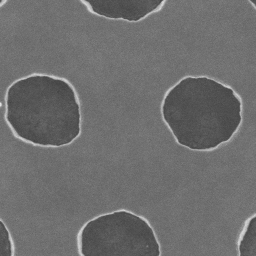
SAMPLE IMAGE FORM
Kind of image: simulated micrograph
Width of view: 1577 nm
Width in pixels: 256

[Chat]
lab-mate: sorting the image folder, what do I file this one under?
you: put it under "holes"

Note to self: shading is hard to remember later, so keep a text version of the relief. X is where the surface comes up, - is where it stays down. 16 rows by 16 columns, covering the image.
XXXXXX----XXXXXX
XXXXXXXXXXXXXXXX
XXXXXXXXXXXXXXXX
XXXXXXXXXXXXXXXX
XXXXXXXXXXXXXXXX
X---XXXXXXX---XX
-----XXXXX-----X
X----XXXXX-----X
X----XXXXXX---XX
XXXXXXXXXXXXXXXX
XXXXXXXXXXXXXXXX
XXXXXXXXXXXXXXXX
XXXXXXXXXXXXXXXX
XXXXXX--XXXXXXXX
XXXXX-----XXXXX-
-XXXX-----XXXXX-